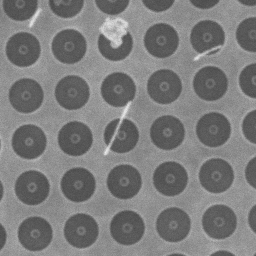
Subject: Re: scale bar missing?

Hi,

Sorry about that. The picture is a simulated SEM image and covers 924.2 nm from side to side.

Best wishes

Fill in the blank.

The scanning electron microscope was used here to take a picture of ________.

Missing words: an array of small figures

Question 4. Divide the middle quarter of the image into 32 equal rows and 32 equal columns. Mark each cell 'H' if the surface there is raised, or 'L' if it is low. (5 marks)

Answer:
HHHHHHHHHHHHHHHHHHHHHHHHHHHHHHHH
HHHHHHHHHHHHHHHHHHHHHHHHLLLHHHHH
HHHHHHHHHHHHLLLLHHHHHHLLLLLLHHHH
LLLLLHHHHHLLLLLLLHHHHLLLLLLLLHHH
LLLLLLHHHLLLLLLLLLHHHLLLLLLLLHHH
LLLLLLHHHLLLLLLLLLHHHLLLHHLLLLHH
LHHLLLLHHLLLLHLLLLHHHLLLLHLLLLHH
LHHLLLLHHLLLLLLLLLHHHLLLLLLLLHHH
LLLLLLHHHHLLLLLLLLHHHHLLLLLLLHHH
LLLLLLHHHHLLLLLLHHHHHHHLLLLHHHHH
LLLLLHHHHHHHLLLHHHHHHHHHHHHHHHHH
HLLHHHHHHHHHHHHHHHHHHHHHHHHHHHHH
HHHHHHHHHHHHHHHHHHHHHHHHHHHHHHHH
HHHHHHHHHHHHHLHHHHHHHHHLLLLLHHHH
HLLLLHHHHHHLLLLLLHHHHHLLLLLLLHHH
LLLLLLHHHHHLLLLLLLHHHHLLLLLLLLHH
LLLLLLLHHHLLLLLLLLLHHLLLLHLLLLHH
LLLLLLLHHHLLLHHLLLLHHLLLLHHLLLHH
LLHHLLLHHHLLLLHLLLLHHHLLLLLLLLHH
LLHHLLLHHHLLLLLLLLLHHHLLLLLLLLHH
LLLLLLLHHHHLLLLLLLHHHHHLLLLLLHHH
LLLLLLHHHHHHLLLLLHHHHHHHLLLHHHHH
HLLLLHHHHHHHHHHHHHHHHHHHHHHHHHHH
HHHHHHHHHHHHHHHHHHHHHHHHHHHHHHHH
HHHHHHHHHHHHHHHHHHHHHHHHHLLLLHHH
HHHHHHHHHHHHHLLLLHHHHHHLLLLLLLHH
HLLLLLHHHHHHLLLLLLHHHHHLLLLLLLLH
LLLLLLLHHHHLLLLLLLLHHHLLLLLLLLLH
LLLLLLLLHHHLLLLLLLLLHHLLLLHLLLLH
LLLHLLLLHHHLLLHHLLLLHHLLLLHLLLLH
LLLHHLLLHHHLLLLLLLLHHHLLLLLLLLLH
LLLLLLLLHHHLLLLLLLLHHHHLLLLLLLHH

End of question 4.